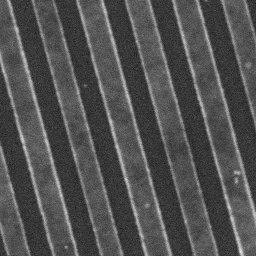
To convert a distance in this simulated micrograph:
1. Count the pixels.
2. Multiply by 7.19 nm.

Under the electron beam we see lines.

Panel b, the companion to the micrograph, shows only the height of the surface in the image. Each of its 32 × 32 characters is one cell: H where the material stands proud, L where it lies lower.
HLLLHHHLLLHHHLLLHHHLLLHHHLLLHHHL
HHLLHHHLLLHHHLLLHHHLLLHHHLLLHHHL
HHLLLHHLLLHHHLLLHHHLLLHHHLLLHHHL
HHLLLHHHLLHHHHLLLHHHLLHHHHLLLHHH
HHLLLHHHLLLHHHLLLHHHLLLHHHLLLHHH
HHHLLLHHLLLHHHLLLHHHLLLHHHLLLHHH
HHHLLLHHLLLHHHHLLHHHLLLHHHLLLHHH
HHHLLLHHHLLLHHHLLLHHHLLHHHHLLLHH
HHHLLLHHHLLLHHHLLLHHHLLLHHHLLLHH
LHHHLLLHHLLLHHHLLLHHHLLLHHHLLLHH
LHHHLLLHHHLLHHHHLLLHHHLLHHHHLLLH
LHHHLLLHHHLLLHHHLLLHHHLLLHHHLLLH
LHHHHLLHHHLLLHHHLLLHHHLLLHHHLLLH
LLHHHLLLHHLLLHHHHLLHHHLLLHHHLLLH
LLHHHLLLHHHLLHHHHLLLHHHLLHHHHLLL
LLHHHLLLHHHLLLHHHLLLHHHLLLHHHLLL
LLHHHHLLHHHLLLHHHLLLHHHLLLHHHLLL
LLLHHHLLLHHLLLHHHHLLHHHLLLHHHLLL
LLLHHHLLLHHHLLLHHHLLLHHHLLHHHHLL
LLLHHHHLLHHHLLLHHHLLLHHHLLLHHHLL
HLLLHHHLLHHHLLLHHHLLLHHHLLLHHHLL
HLLLHHHLLLHHHLLHHHHLLLHHLLLHHHHL
HLLLHHHLLLHHHLLLHHHLLLHHHLLLHHHL
HHLLHHHLLLHHHLLLHHHLLLHHHLLLHHHL
HHLLLHHHLLLHHLLLHHHLLLHHHLLLHHHL
HHLLLHHHLLLHHHLLHHHHLLLHHLLLHHHH
HHLLLHHHLLLHHHLLLHHHLLLHHHLLLHHH
HHHLLHHHHLLHHHLLLHHHLLLHHHLLLHHH
HHHLLLHHHLLLHHLLLHHHHLLHHHLLLHHH
HHHLLLHHHLLLHHHLLLHHHLLLHHHLLHHH
LHHLLLHHHLLLHHHLLLHHHLLLHHHLLLHH
LHHHLLLHHHLLHHHLLLHHHLLLHHHLLLHH